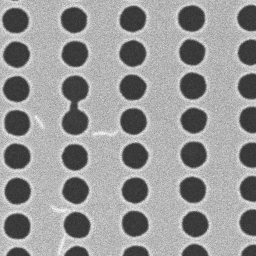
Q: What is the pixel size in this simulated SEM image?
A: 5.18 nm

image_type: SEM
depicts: a regular array of holes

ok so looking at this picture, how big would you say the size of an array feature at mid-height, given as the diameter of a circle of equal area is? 137 nanometres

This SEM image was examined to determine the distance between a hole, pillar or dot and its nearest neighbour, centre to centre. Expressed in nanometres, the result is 176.